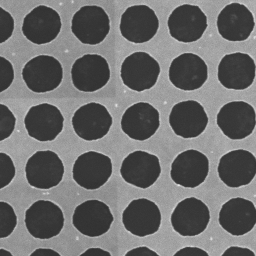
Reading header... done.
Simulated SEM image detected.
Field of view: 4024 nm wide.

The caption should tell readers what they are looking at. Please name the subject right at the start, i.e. a regular array of holes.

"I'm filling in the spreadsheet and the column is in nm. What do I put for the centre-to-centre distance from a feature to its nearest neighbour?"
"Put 752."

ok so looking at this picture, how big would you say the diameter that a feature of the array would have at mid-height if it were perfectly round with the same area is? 606 nanometers